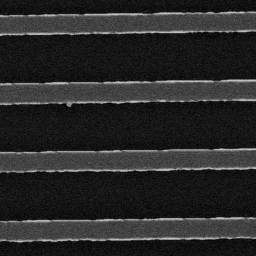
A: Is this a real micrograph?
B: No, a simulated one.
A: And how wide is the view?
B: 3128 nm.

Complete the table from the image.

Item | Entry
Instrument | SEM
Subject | lines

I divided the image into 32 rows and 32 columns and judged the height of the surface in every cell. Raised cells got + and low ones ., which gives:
................................
................................
++++++++++++++++++++++++++++++++
++++++++++++++++++++++++++++++++
................................
................................
................................
................................
................................
................................
......++++++++++++++++++++++++++
++++++++++++++++++++++++++++++++
++++++++++++++++++++++++++......
................................
................................
................................
................................
................................
................................
++++++++++++++++++++++++++++++++
++++++++++++++++++++++++++++++++
+...............................
................................
................................
................................
................................
................................
...................+++++++++++++
++++++++++++++++++++++++++++++++
++++++++++++++++++++++++++++++++
................................
................................